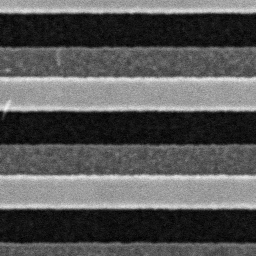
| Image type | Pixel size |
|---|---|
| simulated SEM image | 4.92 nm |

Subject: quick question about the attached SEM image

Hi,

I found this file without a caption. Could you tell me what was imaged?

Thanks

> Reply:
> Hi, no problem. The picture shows lines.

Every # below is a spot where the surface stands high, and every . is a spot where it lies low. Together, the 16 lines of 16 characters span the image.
################
................
................
################
################
################
################
................
................
################
################
################
################
................
................
################